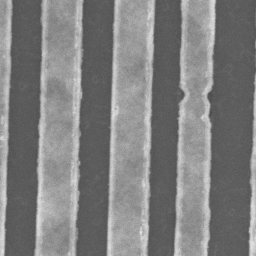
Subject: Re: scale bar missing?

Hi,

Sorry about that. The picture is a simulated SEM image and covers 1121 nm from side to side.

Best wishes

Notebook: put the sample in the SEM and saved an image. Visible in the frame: one or a few lines or trenches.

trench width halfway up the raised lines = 0.155 um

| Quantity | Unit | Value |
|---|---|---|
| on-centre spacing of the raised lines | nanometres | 297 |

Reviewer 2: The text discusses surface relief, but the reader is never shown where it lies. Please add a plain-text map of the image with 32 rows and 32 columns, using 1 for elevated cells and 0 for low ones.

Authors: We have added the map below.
10000011110000011110000111100000
10000011110000011110000111000000
10000011110000011110000111100000
10000011110000011110000111100000
10000111110000011110000111100000
10000011110000111110000111000000
10000011110000111110000111000000
10000111110000111110000111000000
10000111110000111110000111000000
10000111110000111110000111000000
10000111110000111110000111000000
10000111110000111110000111000000
10000111110000111110000111000000
10000111110000111110000111000000
10000111110000111110000111000000
10000111110000111100000111000000
10000111110000111100000111000000
10000111100000111100000111000000
10000111100000111100000111000000
10000111110000111100001111000000
10000111110000111100001111000000
10000111100000111100000111000000
00000111100000111100001111000000
10000111100000111100001111000000
00000111100000111100001111000000
10000111100000111100001111000000
00000111100000111100001111000000
00000111100000111100001111000000
00000111100000111100001111000001
00000111100000111100001111000001
00000111100000111100001111000001
00000111100000111100001111000001